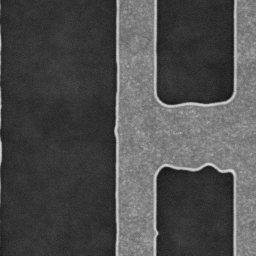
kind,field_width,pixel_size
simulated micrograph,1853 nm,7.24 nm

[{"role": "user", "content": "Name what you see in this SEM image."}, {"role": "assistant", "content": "one or a few lines or trenches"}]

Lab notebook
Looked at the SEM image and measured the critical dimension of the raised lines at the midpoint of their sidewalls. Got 0.275 µm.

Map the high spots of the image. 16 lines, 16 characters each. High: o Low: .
.......ooo.....o
.......ooo.....o
.......ooo.....o
.......ooo.....o
.......ooo.....o
.......ooo.....o
.......ooo...ooo
.......ooooooooo
.......ooooooooo
.......ooooooooo
.......ooo.o..oo
.......ooo.....o
.......ooo.....o
.......ooo.....o
.......ooo.....o
.......ooo.....o